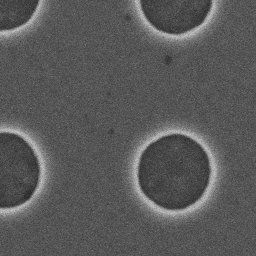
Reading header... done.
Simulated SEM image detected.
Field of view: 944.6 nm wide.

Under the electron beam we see holes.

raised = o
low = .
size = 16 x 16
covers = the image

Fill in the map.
..ooooooo....ooo
..ooooooo....ooo
oooooooooooooooo
oooooooooooooooo
oooooooooooooooo
oooooooooooooooo
oooooooooooooooo
oooooooooooooooo
.ooooooooo..oooo
..ooooooo....ooo
...oooooo....ooo
..ooooooo....ooo
..ooooooo...oooo
oooooooooooooooo
oooooooooooooooo
oooooooooooooooo